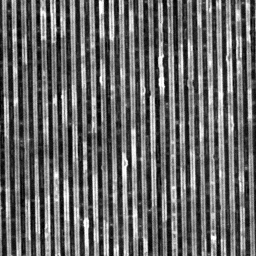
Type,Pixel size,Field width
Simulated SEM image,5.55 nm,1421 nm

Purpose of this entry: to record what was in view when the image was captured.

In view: parallel lines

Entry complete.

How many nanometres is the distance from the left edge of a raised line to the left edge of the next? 54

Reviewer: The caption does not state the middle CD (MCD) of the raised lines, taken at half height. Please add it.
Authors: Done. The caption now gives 22.2 nanometers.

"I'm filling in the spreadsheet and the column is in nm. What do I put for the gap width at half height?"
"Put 33.3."